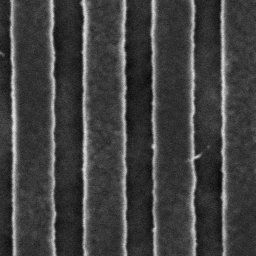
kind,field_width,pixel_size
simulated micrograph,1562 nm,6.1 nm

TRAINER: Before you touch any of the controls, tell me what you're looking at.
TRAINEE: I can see lines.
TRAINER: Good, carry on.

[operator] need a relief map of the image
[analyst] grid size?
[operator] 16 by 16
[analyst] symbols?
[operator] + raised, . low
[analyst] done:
.++..+++..++..++
.++..+++..++..++
.++..+++..++..++
.++..+++..++..++
.++..+++..++..++
.++..+++..++..++
.++..+++..++..++
.++..+++..++..++
.++..+++..++..++
.++..+++..++..++
.++..+++..++..++
.++..+++..++..++
.++..+++..++..++
.++..+++..++..++
.++..+++..++..++
.++..+++..++..++